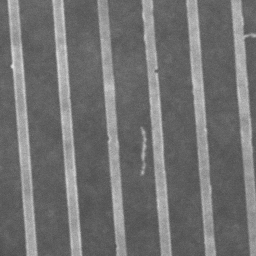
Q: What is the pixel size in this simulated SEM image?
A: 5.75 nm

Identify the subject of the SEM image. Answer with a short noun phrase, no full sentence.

parallel lines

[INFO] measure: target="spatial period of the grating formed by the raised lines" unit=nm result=256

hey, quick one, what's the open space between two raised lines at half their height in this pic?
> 202 nm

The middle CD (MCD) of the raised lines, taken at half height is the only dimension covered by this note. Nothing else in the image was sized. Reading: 53 nm